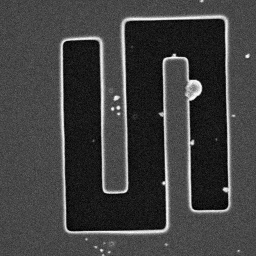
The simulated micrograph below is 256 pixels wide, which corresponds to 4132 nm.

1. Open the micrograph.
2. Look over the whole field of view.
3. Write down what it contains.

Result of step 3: groups of lines, slits or small figures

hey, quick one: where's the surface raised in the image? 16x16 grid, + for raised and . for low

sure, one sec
++++++++++++++++
++++++++......++
+++++.++......++
++++..++......++
++++..++..++..++
++++..++..+++.++
++++..++..++..++
++++..++..++..++
++++..++..++..++
++++..++..++..++
++++..++..++..++
++++..++..++..++
++++......++..++
++++......++++++
++++++++++++++++
++++++++++++++++